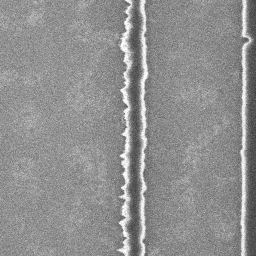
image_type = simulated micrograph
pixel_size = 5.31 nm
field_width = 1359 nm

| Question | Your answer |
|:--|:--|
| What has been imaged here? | one or a few lines or trenches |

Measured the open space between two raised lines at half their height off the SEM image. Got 529 nanometers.